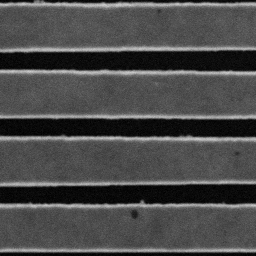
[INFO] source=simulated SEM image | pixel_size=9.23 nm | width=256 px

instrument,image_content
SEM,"lines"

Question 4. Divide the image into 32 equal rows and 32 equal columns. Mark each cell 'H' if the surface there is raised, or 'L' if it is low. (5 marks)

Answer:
HHHHHHHHHHHHHHHHHHHHHHHHHHHHHHHH
HHHHHHHHHHHHHHHHHHHHHHHHHHHHHHHH
HHHHHHHHHHHHHHHHHHHHHHHHHHHHHHHH
HHHHHHHHHHHHHHHHHHHHHHHHHHHHHHHH
HHHHHHHHHHHHHHHHHHHHHHHHHHHHHHHH
HHHHHHHHHHHHHHHHHHHHHHHHHHHHHHHH
LLLLLLLLLLLLLLLLLLLLLLLLLLLLLLLL
LLLLLLLLLLLLLLLLLLLLLLLLLLLLLLLL
LLLLLLLLLLLLLLLLLLLLLLLLLLLLLLLL
HHHHHHHHHHHHHHHHHHHHHHHHHHHHHHHH
HHHHHHHHHHHHHHHHHHHHHHHHHHHHHHHH
HHHHHHHHHHHHHHHHHHHHHHHHHHHHHHHH
HHHHHHHHHHHHHHHHHHHHHHHHHHHHHHHH
HHHHHHHHHHHHHHHHHHHHHHHHHHHHHHHH
HHHHHHHHHHHHHHHHHHHHHHHHHHHHHHHH
LLLLLLLLLLLLLLLLLLLLLLLLLLLLLLLL
LLLLLLLLLLLLLLLLLLLLLLLLLLLLLLLL
HHHHHHHHHHHHHHHHHHHHHHHHHHHHHHHH
HHHHHHHHHHHHHHHHHHHHHHHHHHHHHHHH
HHHHHHHHHHHHHHHHHHHHHHHHHHHHHHHH
HHHHHHHHHHHHHHHHHHHHHHHHHHHHHHHH
HHHHHHHHHHHHHHHHHHHHHHHHHHHHHHHH
HHHHHHHHHHHHHHHHHHHHHHHHHHHHHHHH
LLLLLLLLLLLLLLLLLLLLLLLLLLLLLLLL
LLLLLLLLLLLLLLLLLLLLLLLLLLLLLLLL
LLLLLLLLLLLLLLLLLLLLLLLLLLLLLLLL
HHHHHHHHHHHHHHHHHHHHHHHHHHHHHHHH
HHHHHHHHHHHHHHHHHHHHHHHHHHHHHHHH
HHHHHHHHHHHHHHHHHHHHHHHHHHHHHHHH
HHHHHHHHHHHHHHHHHHHHHHHHHHHHHHHH
HHHHHHHHHHHHHHHHHHHHHHHHHHHHHHHH
LLLLLLLLLLLLLLLLLLLLLLLLLLLLLLLL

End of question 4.